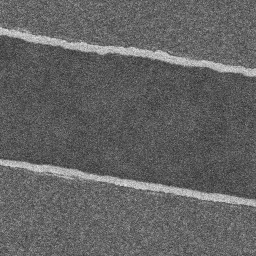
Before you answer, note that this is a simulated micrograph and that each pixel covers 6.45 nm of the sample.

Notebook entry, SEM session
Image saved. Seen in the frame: one or a few lines or trenches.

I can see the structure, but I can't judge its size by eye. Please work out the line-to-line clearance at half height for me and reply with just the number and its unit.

817 nm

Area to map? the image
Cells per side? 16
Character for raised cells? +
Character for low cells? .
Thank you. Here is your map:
++++++++++++++++
++++++++++++++++
..++++++++++++++
..........++++++
...............+
................
................
................
................
................
+++.............
+++++++++.......
+++++++++++++++.
++++++++++++++++
++++++++++++++++
++++++++++++++++